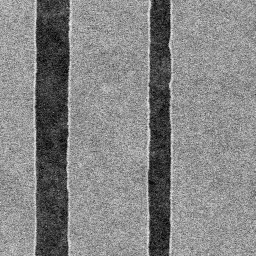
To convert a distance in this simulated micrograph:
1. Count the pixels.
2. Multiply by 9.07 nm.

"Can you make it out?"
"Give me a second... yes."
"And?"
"one or a few lines or trenches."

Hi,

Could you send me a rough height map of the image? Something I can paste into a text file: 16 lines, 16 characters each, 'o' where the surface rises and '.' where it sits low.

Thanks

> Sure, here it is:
oo..ooooo..ooooo
oo..ooooo..ooooo
oo..ooooo..ooooo
oo..ooooo..ooooo
oo..ooooo..ooooo
oo..ooooo..ooooo
oo..ooooo..ooooo
oo..ooooo..ooooo
oo..ooooo..ooooo
oo..ooooo..ooooo
oo..ooooo..ooooo
oo..ooooo..ooooo
oo..ooooo..ooooo
oo..ooooo..ooooo
oo..ooooo..ooooo
oo..ooooo..ooooo